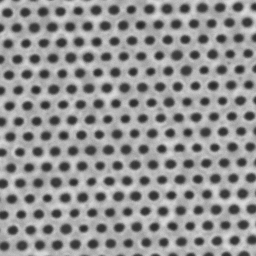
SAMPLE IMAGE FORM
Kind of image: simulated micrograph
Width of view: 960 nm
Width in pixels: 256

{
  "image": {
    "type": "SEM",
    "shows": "a regular array of holes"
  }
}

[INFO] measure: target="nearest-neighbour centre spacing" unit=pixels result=17.4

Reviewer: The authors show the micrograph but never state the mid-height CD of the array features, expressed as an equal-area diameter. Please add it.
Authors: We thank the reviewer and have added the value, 10 pixels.